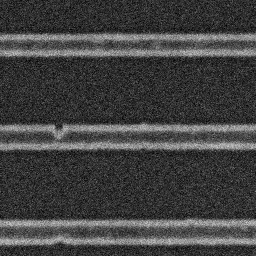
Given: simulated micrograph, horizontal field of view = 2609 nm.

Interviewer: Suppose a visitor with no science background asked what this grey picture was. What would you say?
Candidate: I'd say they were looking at one or a few lines or trenches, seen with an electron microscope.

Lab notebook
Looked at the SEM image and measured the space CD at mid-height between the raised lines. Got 766 nm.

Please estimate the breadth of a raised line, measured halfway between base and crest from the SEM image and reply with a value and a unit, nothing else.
196 nm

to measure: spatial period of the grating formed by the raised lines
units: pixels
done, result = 93.7